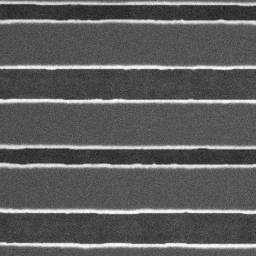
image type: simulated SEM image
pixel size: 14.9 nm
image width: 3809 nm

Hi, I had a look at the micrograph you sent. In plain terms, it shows lines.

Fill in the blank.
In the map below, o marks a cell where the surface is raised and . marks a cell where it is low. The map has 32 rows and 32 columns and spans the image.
......o......ooo....oooooooooooo
................................
................................
oooooooooooooooooooooooooooooooo
oooooooooooooooooooooooooooooooo
oooooooooooooooooooooooooooooooo
oooooooooooooooooooooooooooooooo
oooooooooooooooooooooooooooooooo
.ooooooooo.....ooo.ooooooooooooo
................................
................................
................................
................................
oooooooooooooooooooooooooooooooo
oooooooooooooooooooooooooooooooo
oooooooooooooooooooooooooooooooo
oooooooooooooooooooooooooooooooo
oooooooooooooooooooooooooooooooo
.............................ooo
................................
................................
oooooooooooooooooooooooooooooooo
oooooooooooooooooooooooooooooooo
oooooooooooooooooooooooooooooooo
oooooooooooooooooooooooooooooooo
oooooooooooooooooooooooooooooooo
......o.o...oooooo.o....o..ooooo
................................
................................
................................
ooooo.oo........................
oooooooooooooooooooooooooooooooo